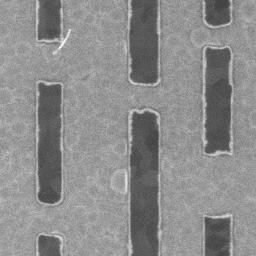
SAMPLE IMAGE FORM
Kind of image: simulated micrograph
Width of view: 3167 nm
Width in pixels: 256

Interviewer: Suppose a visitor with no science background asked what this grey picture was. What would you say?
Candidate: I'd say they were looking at one or a few lines or trenches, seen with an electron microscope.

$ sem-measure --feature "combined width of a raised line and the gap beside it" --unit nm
1020